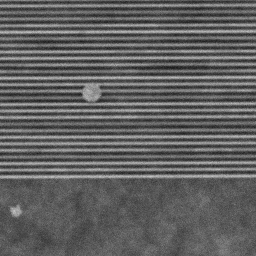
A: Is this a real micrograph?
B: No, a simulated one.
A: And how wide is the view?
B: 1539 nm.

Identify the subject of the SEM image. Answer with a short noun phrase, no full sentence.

parallel lines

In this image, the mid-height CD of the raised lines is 10.5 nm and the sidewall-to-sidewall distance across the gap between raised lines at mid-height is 30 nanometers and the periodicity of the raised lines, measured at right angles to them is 0.0394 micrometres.